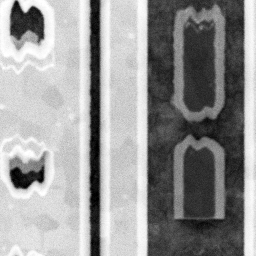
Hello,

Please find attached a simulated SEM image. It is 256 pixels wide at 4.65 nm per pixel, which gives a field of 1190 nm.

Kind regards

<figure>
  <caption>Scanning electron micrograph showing one or a few lines or trenches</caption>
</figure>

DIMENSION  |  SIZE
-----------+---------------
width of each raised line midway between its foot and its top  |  181 nanometres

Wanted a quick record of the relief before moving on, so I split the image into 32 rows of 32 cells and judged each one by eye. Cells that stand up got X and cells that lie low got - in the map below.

X--X-XXXXXX--XXXXX-------------X
X-----XXXXX--XXXXX-------------X
X-----XXXXX--XXXXX----XXXXX----X
X-----XXXXX--XXXXX----XXXXXX---X
X-----XXXXX--XXXXX----XXXXXX---X
X-----XXXXX--XXXXX----XXXXX----X
XX-XXXXXXXX--XXXXX----XXXXX----X
XXXXXXXXXXX--XXXXX----XXXXX----X
XXXXXXXXXXX--XXXXX----XXXXX----X
XXXXXXXXXXX--XXXXX----XXXXX----X
XXXXXXXXXXX--XXXXX----XXXXX----X
XXXXXXXXXXX--XXXXX----XXXXX----X
XXXXXXXXXXX--XXXXX----XXXXX----X
XXXXXXXXXXX--XXXXX-----XXXX----X
XXXXXXXXXXX--XXXXX------X------X
XXXXXXXXXXX--XXXXX-------------X
XXXXXXXXXXX--XXXXX-------------X
XXXXXXXXXXX--XXXXX-------------X
XXXXXXXXXXX--XXXXX-----XXXX----X
X--XX-XXXXX--XXXXX----XXXXX----X
X-----XXXXX--XXXXX----XXXXX----X
X-----XXXXX--XXXXX----XXXXX----X
X-----XXXXX--XXXXX----XXXXX----X
X---XXXXXXX--XXXXX----XXXXX----X
XXXXXXXXXXX--XXXXX----XXXXX----X
XXXXXXXXXXX--XXXXX----XXXXX----X
XXXXXXXXXXX--XXXXX----XXXXX----X
XXXXXXXXXXX--XXXXX-------------X
XXXXXXXXXXX--XXXXX-------------X
XXXXXXXXXXX--XXXXX-------------X
XXXXXXXXXXX--XXXXX-------------X
XXXXXXXXXXX--XXXXX-------------X